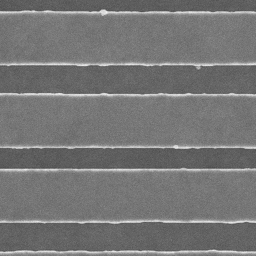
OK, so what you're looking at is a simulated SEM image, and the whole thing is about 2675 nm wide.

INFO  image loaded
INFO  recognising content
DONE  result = lines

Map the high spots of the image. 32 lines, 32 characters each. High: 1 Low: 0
00000000000000000000000000000000
11111111111111111111111111111111
11111111111111111111111111111111
11111111111111111111111111111111
11111111111111111111111111111111
11111111111111111111111111111111
11111111111111111111111111111111
11111111111111111111111111111111
00000000000000000000000000000000
00000000000000000000000000000000
00000000000000000000000000000000
00000000000000000000000000000000
11111111111111111111111111111111
11111111111111111111111111111111
11111111111111111111111111111111
11111111111111111111111111111111
11111111111111111111111111111111
11111111111111111111111111111111
01110100110000000000011110000011
00000000000000000000000000000000
00000000000000000000000000000000
11111111111111111111111111111111
11111111111111111111111111111111
11111111111111111111111111111111
11111111111111111111111111111111
11111111111111111111111111111111
11111111111111111111111111111111
11111111111111111111111111111111
00000000000000000000000000000000
00000000000000000000000000000000
00000000000000000000000000000000
00111110111001111111001111111100